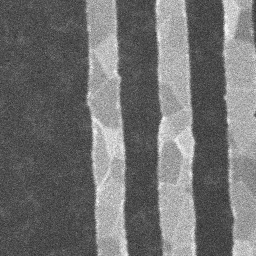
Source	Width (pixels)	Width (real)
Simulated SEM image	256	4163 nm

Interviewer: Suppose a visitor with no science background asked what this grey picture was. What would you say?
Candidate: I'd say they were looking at one or a few lines or trenches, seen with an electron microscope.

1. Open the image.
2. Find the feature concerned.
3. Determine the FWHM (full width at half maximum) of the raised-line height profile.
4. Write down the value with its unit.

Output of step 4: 29.2 pixels